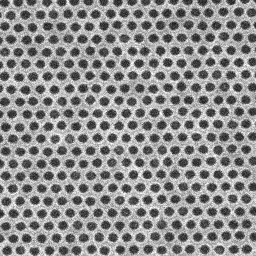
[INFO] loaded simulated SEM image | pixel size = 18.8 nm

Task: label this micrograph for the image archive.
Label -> a regular array of holes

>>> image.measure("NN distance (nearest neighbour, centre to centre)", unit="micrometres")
0.255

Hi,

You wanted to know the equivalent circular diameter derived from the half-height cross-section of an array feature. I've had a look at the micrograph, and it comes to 204 nm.